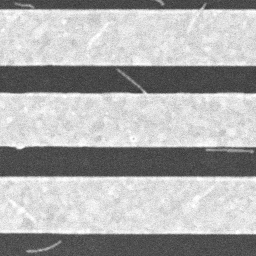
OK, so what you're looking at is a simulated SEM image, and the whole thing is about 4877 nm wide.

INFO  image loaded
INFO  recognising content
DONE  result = lines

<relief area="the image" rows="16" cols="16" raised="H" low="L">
LLLLLLLLLLLLLLLL
HHHHHHHHHHHHHHHH
HHHHHHHHHHHHHHHH
HHHHHHHHHHHHHHHH
LLLLLLLLLLLLLLLL
LLLLLLLLLLLLLLLL
HHHHHHHHHHHHHHHH
HHHHHHHHHHHHHHHH
HHHHHHHHHHHHHHHH
LLLLLLLLLLLLLLLL
LLLLLLLLLLLLLLLL
HHHHHHHHHHHHHHHH
HHHHHHHHHHHHHHHH
HHHHHHHHHHHHHHHH
HHHHHHHHHHHHHHHH
LLLLLLLLLLLLLLLL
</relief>